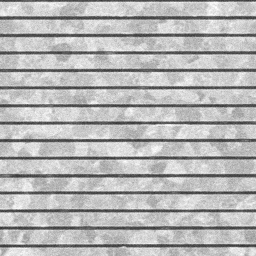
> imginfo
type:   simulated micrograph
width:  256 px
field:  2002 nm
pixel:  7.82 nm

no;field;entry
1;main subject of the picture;parallel lines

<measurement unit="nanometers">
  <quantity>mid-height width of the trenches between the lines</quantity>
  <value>27.4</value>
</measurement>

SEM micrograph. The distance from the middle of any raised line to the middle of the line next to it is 137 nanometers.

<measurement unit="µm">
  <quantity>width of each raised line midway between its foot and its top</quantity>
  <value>0.109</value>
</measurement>